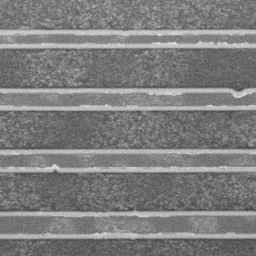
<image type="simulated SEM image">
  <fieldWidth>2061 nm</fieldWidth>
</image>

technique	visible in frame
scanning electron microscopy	one or a few lines or trenches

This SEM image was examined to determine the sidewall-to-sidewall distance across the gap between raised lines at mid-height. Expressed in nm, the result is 347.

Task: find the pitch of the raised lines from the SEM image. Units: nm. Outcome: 500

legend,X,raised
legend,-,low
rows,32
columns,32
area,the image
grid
--------------------------------
--------------------------------
--------------------------------
--------------------------------
XXXXXXXXXXXXXXXXXXXXXXXXXXXXXXXX
XXXXXXXXXXXXXXXXXXXXXXXXXXXXXXXX
--------------------------------
--------------------------------
--------------------------------
--------------------------------
--------------------------------
XXXXXXXXXXXXXXXXXXXXXXXXXXXXX-XX
XXXXXXXXXXXXXXXXXXXXXXXXXXXXXXXX
---------XXXXXXXXX--------------
--------------------------------
--------------------------------
--------------------------------
--------------------------------
--------------------------------
XXXXXXXXXXXXXXXXXXXXXXXXXXXXXXXX
XXXXXXXXXXXXXXXXXXXXXXXXXXXXXXXX
--------------------------------
--------------------------------
--------------------------------
--------------------------------
--------------------------------
--------------------------------
XXXXXXXXXXXXXXXXXXXXXXXXXXXXXXXX
XXXXXXXXXXXXXXXXXXXXXXXXXXXXXXXX
XXXXXXXXXXXXXXXXXXXXXXXX--------
--------------------------------
--------------------------------